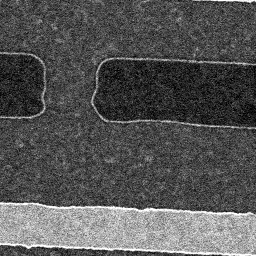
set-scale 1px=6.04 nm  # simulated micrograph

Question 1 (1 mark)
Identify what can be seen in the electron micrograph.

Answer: one or a few lines or trenches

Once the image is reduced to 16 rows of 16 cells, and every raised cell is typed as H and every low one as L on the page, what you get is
LLLLLLLLLLLLLLLL
LLLLLLLLLLLLLLLL
LLLLLLLLLLLLLLLL
HHLLLLLLLLLLLLLL
HHHLLLHHHHHHHHHH
HHHLLLHHHHHHHHHH
HHHLLLHHHHHHHHHH
LLLLLLLHHHHHHHHH
LLLLLLLLLLLLLLLL
LLLLLLLLLLLLLLLL
LLLLLLLLLLLLLLLL
LLLLLLLLLLLLLLLL
LLLLLLLLLLLLLLLL
HHHHHHHHHHHHHHHH
HHHHHHHHHHHHHHHH
LLLLLHHHHHHHHHHH